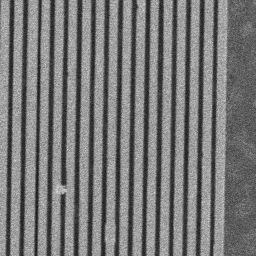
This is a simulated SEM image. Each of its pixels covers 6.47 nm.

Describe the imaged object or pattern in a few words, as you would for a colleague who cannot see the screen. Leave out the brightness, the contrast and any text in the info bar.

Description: parallel lines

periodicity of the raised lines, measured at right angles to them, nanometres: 88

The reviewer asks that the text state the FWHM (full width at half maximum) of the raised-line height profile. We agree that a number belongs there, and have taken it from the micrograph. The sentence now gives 0.0582 µm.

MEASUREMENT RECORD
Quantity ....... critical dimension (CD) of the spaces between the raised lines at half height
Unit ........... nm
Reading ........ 29.1